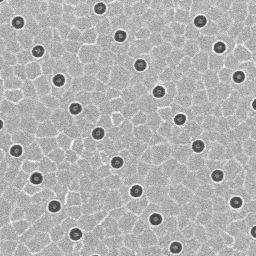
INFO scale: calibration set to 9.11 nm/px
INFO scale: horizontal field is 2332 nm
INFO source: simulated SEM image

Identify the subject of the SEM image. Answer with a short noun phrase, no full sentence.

a regular array of ring-shaped grooves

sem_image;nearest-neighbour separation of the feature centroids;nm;300